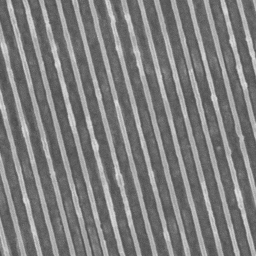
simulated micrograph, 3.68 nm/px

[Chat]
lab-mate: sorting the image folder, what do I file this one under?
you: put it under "parallel lines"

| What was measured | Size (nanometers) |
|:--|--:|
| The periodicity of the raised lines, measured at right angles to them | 58.6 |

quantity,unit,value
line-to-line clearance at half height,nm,43.7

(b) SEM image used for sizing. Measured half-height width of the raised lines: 15.6 nm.